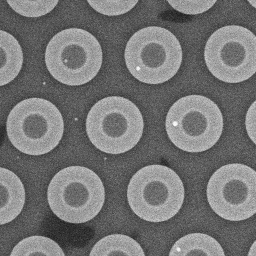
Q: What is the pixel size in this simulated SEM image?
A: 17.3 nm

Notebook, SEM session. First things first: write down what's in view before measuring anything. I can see an array of small figures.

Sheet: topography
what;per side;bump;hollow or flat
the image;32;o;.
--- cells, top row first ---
.oooooo....oooooo....oooooo....o
..oooo......oooo.......oo.......
................................
..................oo........ooo.
oo.....ooooo.....ooooo....oooooo
oo....oooooo....oooooo....oooooo
ooo...ooooooo...ooooooo...oooooo
ooo...ooooooo...ooooooo...oooooo
ooo...oooooo....oooooo....oooooo
oo.....ooooo.....ooooo.....oooo.
o.......oo......................
................................
...ooo.......ooo......oooo......
..ooooo....oooooo....oooooo....o
.ooooooo...ooooooo...ooooooo...o
.ooooooo...ooooooo...ooooooo...o
.ooooooo...ooooooo...ooooooo...o
.ooooooo...oooooo....oooooo....o
..ooooo.....oooo......oooo......
................................
.............................o..
o......ooooo.....ooooo.....ooooo
oo....ooooooo...ooooooo...oooooo
ooo...ooooooo...ooooooo...oooooo
ooo...ooooooo...ooooooo...oooooo
ooo...ooooooo...ooooooo...oooooo
oo.....ooooo.....ooooo.....ooooo
o.......ooo.......ooo........o..
................................
.............ooo.......ooo......
..ooooo.....ooooo.....ooooo.....
.ooooooo...ooooooo...ooooooo...o